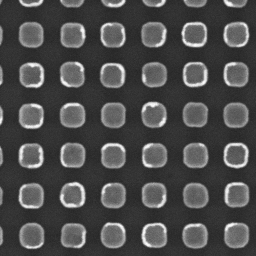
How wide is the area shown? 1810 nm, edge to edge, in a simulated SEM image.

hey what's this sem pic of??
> a regular array of raised bodies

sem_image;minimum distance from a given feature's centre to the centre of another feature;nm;282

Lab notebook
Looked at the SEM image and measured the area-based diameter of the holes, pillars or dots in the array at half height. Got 0.183 microns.